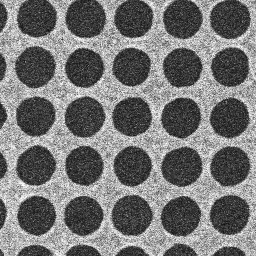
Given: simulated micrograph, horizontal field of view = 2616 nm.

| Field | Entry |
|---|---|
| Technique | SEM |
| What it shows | a regular array of holes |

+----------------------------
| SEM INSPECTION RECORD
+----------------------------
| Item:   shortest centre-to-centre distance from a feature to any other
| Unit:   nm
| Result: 493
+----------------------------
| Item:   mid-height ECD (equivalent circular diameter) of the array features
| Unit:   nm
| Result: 405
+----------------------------